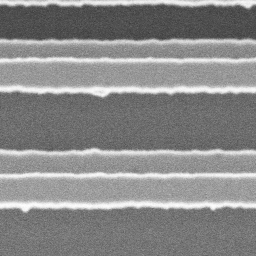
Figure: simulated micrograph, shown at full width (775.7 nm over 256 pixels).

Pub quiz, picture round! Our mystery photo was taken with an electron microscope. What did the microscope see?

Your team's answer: lines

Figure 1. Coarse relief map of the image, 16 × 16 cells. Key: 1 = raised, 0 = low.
0000000000000000
0000000000000000
0000000000000000
1111111111111111
1111111111111111
1111111111111111
0000000000000000
0000000000000000
0000000000000000
1110111111111111
1111111111111111
1111111111111111
1111111111111111
0000000000000000
0000000000000000
0000000000000000